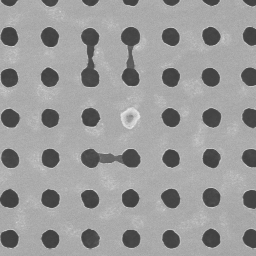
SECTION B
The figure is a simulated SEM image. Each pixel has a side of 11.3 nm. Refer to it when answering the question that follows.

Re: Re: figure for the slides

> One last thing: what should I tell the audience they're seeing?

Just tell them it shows a regular array of holes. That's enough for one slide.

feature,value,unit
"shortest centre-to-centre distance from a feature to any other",40.1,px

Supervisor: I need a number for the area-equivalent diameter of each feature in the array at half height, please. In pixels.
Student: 18.6